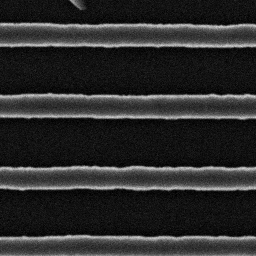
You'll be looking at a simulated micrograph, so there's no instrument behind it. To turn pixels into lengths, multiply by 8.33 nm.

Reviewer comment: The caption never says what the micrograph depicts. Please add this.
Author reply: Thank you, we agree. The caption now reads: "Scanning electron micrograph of lines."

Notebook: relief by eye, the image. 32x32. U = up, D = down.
DDDDDDDDDDDDDDDDDDDDDDDDDDDDDDDD
DDDDDDDDDDDDDDDDDDDDDDDDDDDDDDDD
DDDDDDDDDDDDDDDDDDDDDDDDDDDDDDDD
UUUUUUUUUUUUUUUUUUUUUUUUUUUUUUUU
UUUUUUUUUUUUUUUUUUUUUUUUUUUUUUUU
UUUUUUUUUUUUUUUUUUUUUUUUUUUUUUUU
DDDDDDDDDDDDDDDDDDDDDDDDDDDDDDDD
DDDDDDDDDDDDDDDDDDDDDDDDDDDDDDDD
DDDDDDDDDDDDDDDDDDDDDDDDDDDDDDDD
DDDDDDDDDDDDDDDDDDDDDDDDDDDDDDDD
DDDDDDDDDDDDDDDDDDDDDDDDDDDDDDDD
DDDDDDDDDDDDDDDDDDDDDDDDDDDDDDDD
UUUUUUUUUUUUUUUUUUUUUUUUUUUUUUUU
UUUUUUUUUUUUUUUUUUUUUUUUUUUUUUUU
UUUUUUUUUUUUUUUUUUUUUUUUUUUUUUUU
DDDDDDDDDDDDDDDDDDDDDDDDDDDDDDDD
DDDDDDDDDDDDDDDDDDDDDDDDDDDDDDDD
DDDDDDDDDDDDDDDDDDDDDDDDDDDDDDDD
DDDDDDDDDDDDDDDDDDDDDDDDDDDDDDDD
DDDDDDDDDDDDDDDDDDDDDDDDDDDDDDDD
DDDDDDDDDDDDDDDDDDDDDDDDDDDDDDDD
UUUUUUUUUUUUUUUUUUUUUUUUUUUUUUUU
UUUUUUUUUUUUUUUUUUUUUUUUUUUUUUUU
DUUUUUUUUDDDUUDDUUUUUUUUUUUUUUUU
DDDDDDDDDDDDDDDDDDDDDDDDDDDDDDDD
DDDDDDDDDDDDDDDDDDDDDDDDDDDDDDDD
DDDDDDDDDDDDDDDDDDDDDDDDDDDDDDDD
DDDDDDDDDDDDDDDDDDDDDDDDDDDDDDDD
DDDDDDDDDDDDDDDDDDDDDDDDDDDDDDDD
DDDDDDDDUUUDDDDDDDDDDDDDDDDDDDDD
UUUUUUUUUUUUUUUUUUUUUUUUUUUUUUUU
UUUUUUUUUUUUUUUUUUUUUUUUUUUUUUUU